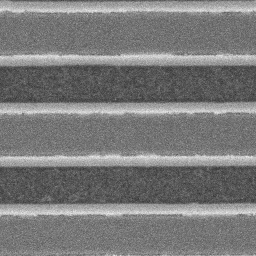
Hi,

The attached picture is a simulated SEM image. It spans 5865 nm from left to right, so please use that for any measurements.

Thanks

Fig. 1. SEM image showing one or a few lines or trenches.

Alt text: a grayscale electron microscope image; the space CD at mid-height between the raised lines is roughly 1100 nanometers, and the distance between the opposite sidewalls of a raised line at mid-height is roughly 1.21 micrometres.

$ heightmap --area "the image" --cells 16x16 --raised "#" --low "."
################
################
################
################
................
................
................
################
################
################
................
................
................
################
################
################